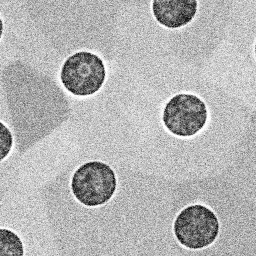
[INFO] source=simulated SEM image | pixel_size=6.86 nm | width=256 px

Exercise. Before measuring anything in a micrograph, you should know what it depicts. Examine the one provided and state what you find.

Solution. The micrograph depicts holes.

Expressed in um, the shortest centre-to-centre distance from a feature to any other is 0.754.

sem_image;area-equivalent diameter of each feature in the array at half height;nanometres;310